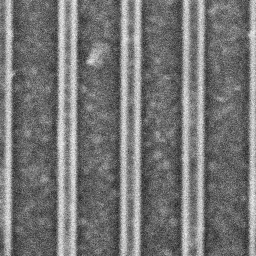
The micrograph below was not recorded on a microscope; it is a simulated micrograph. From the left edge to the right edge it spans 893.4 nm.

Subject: one or a few lines or trenches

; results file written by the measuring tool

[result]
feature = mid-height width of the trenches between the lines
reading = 0.177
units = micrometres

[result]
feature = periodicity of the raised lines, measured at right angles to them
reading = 0.22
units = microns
